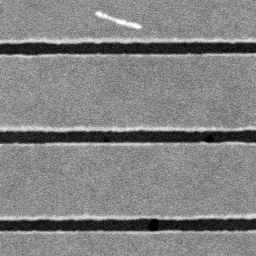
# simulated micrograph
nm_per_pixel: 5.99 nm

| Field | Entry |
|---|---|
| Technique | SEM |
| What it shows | lines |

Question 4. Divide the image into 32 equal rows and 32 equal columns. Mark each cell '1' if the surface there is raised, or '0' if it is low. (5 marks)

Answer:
11111111111111111111111111111111
11111111111111111111111111111111
11111111111111111111111111111111
11111111111111111111111111111111
11111111111111111111111111111111
00000000000000000000000000000000
00000000000000000000000000000000
11111111111111111111111111111111
11111111111111111111111111111111
11111111111111111111111111111111
11111111111111111111111111111111
11111111111111111111111111111111
11111111111111111111111111111111
11111111111111111111111111111111
11111111111111111111111111111111
11111111111111111111111111111111
00000000000000000000000000000000
00000000000000000000000000000000
11111111111111111111111111111111
11111111111111111111111111111111
11111111111111111111111111111111
11111111111111111111111111111111
11111111111111111111111111111111
11111111111111111111111111111111
11111111111111111111111111111111
11111111111111111111111111111111
11111111111111111111111111111111
00000000000000000000000000000000
00000000000000000000000000000000
11111111111111111111111111111111
11111111111111111111111111111111
11111111111111111111111111111111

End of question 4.